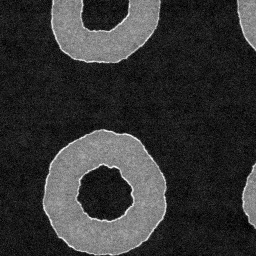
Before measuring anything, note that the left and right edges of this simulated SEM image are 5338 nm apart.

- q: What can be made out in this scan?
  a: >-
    ring-shaped raised bodies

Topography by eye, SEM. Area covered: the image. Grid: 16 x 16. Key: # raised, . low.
...##...##.....#
...##..###.....#
....#####......#
....####........
................
................
................
................
.....###........
....#####.......
...###.###......
...##...##.....#
...##...##.....#
...###..##.....#
....#####.......
.....###........